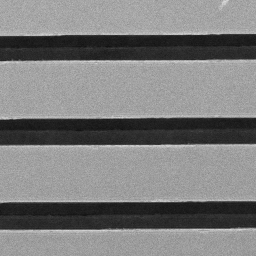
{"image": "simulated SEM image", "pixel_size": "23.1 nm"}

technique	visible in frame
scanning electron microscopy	lines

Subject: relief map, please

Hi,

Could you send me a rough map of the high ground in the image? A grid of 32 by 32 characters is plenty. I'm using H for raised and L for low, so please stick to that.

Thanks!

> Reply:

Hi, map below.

HHHHHHHHHHHHHHHHHHHHHHHHHHHHHHHH
HHHHHHHHHHHHHHHHHHHHHHHHHHHHHHHH
HHHHHHHHHHHHHHHHHHHHHHHHHHHHHHHH
HHHHHHHHHHHHHHHHHHHHHHHHHHHHHHHH
LLLLLLLLLLLLLLLLLLLLLLLLLLLLLLLL
LLLLLLLLLLLLLLLLLLLLLLLLLLLLLLLL
LLLLLLLLLLLLLLLLLLLLLLLLLLLLLLLL
LLLLLLLLLLLLLLLLLLLLLLLLLLHHHHHH
HHHHHHHHHHHHHHHHHHHHHHHHHHHHHHHH
HHHHHHHHHHHHHHHHHHHHHHHHHHHHHHHH
HHHHHHHHHHHHHHHHHHHHHHHHHHHHHHHH
HHHHHHHHHHHHHHHHHHHHHHHHHHHHHHHH
HHHHHHHHHHHHHHHHHHHHHHHHHHHHHHHH
HHHHHHHHHHHHHHHHHHHHHHHHHHHHHHHH
HHHHHHHHHHHHHHHHHHHHHHHHHHHHHHHH
LLLLLLLLLLLLLLLLLLLLLLLLLLLLLLLL
LLLLLLLLLLLLLLLLLLLLLLLLLLLLLLLL
LLLLLLLLLLLLLLLLLLLLLLLLLLLLLLLL
HHHHHHHHHHHHHHHHHHHHHHHHHHHHHHHH
HHHHHHHHHHHHHHHHHHHHHHHHHHHHHHHH
HHHHHHHHHHHHHHHHHHHHHHHHHHHHHHHH
HHHHHHHHHHHHHHHHHHHHHHHHHHHHHHHH
HHHHHHHHHHHHHHHHHHHHHHHHHHHHHHHH
HHHHHHHHHHHHHHHHHHHHHHHHHHHHHHHH
HHHHHHHHHHHHHHHHHHHHHHHHHHHHHHHH
LLLLLLLLLLLLLLLLLLLLLLLLLLLLLLLL
LLLLLLLLLLLLLLLLLLLLLLLLLLLLLLLL
LLLLLLLLLLLLLLLLLLLLLLLLLLLLLLLL
LLLLLLLLLLLLLLLLLLLLLLLLLLLLLLLL
HHHHHHHHHHHHHHHHHHHHHHHHHHHHHHHH
HHHHHHHHHHHHHHHHHHHHHHHHHHHHHHHH
HHHHHHHHHHHHHHHHHHHHHHHHHHHHHHHH